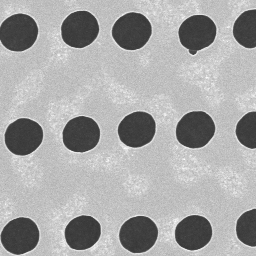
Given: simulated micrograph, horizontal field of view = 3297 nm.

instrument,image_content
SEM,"a regular array of holes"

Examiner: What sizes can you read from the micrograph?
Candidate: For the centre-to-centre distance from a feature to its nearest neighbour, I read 721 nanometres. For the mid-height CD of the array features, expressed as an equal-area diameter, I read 482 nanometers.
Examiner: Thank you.